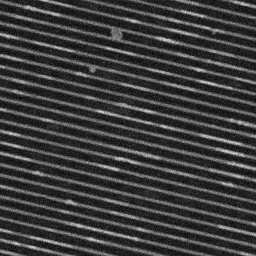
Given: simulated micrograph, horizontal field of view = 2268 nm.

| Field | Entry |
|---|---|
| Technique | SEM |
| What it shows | parallel lines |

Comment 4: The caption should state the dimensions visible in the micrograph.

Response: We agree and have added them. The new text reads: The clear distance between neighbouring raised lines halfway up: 0.0722 µm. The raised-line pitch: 93.8 nanometres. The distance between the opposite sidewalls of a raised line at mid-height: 23.7 nanometers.